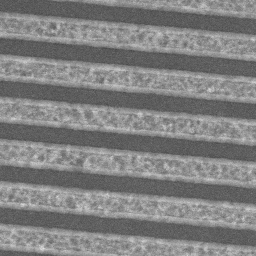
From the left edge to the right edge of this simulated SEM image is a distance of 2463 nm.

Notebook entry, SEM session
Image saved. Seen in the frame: parallel lines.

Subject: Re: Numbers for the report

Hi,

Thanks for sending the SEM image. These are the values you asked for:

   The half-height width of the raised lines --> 208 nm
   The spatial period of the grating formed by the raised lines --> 406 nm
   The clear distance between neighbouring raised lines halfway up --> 0.193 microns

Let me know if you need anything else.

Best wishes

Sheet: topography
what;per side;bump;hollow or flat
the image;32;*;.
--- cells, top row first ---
..............******************
.........................*******
********........................
*******************.............
******************************..
...........*********************
.......................*********
*****...........................
****************................
***************************.....
........************************
...................*************
**............................**
*************...................
************************........
.....***************************
................****************
..........................******
**********......................
********************............
..*****************************.
............********************
.......................*********
*******.........................
*****************...............
****************************....
.........***********************
.....................***********
****............................
**************..................
*************************.......
......**************************